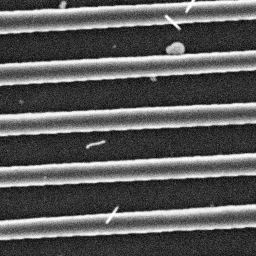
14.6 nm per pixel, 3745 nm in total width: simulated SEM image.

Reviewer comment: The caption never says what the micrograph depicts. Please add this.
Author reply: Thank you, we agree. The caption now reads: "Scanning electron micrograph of lines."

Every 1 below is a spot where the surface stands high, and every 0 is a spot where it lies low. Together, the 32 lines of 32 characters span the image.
00000000000000000000001111111111
00001111111111111111111111111111
11111111111111111111111111110000
11111111111100000000000000000000
00000000000000000000000000000000
00000000000000000000000000000000
00000000000000000000000000000001
00000000000011111111111111111111
11111111111111111111111111111111
11111111111111111100000000000000
11000000000000000000000000000000
00000000000000000000000000000000
00000000000000000000000000000000
00000000000000000000011111111111
01111111111111111111111111111111
11111111111111111111111111111000
11111110000000000000000000000000
00000000000000000000000000000000
00000000000000000000000000000000
00000000000000000000000000000111
00000000000111111111111111111111
11111111111111111111111111111111
11111111111111111000000000000000
00000000000000000000000000000000
00000000000000000000000000000000
00000000000000000000000000000000
00000000000000000000001111111111
00011111111111111111111111111111
11111111111111111111111111111000
11111110000000000000000000000000
00000000000000000000000000000000
00000000000000000000000000000000